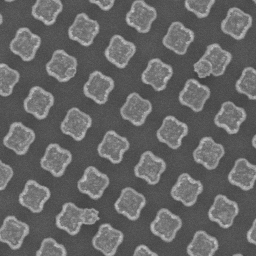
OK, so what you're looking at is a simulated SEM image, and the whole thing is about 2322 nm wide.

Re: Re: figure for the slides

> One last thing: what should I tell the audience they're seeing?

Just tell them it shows a regular array of raised bodies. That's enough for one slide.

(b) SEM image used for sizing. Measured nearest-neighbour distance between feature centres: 373 nanometers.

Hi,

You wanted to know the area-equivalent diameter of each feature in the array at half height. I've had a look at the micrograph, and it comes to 0.253 µm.